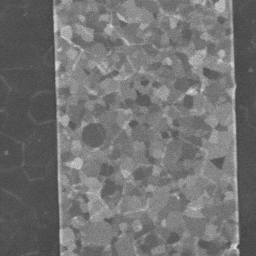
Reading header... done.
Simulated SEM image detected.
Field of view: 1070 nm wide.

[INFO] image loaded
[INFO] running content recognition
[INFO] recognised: one or a few lines or trenches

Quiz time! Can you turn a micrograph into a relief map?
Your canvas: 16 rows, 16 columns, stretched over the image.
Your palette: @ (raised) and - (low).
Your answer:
---@@@@@@@@@@@--
---@@@@@@@@@@@--
---@@@@@@@@@@@--
----@@@@@@@@@@@-
----@@@@@@@@@@@-
----@@@@@@@@@@@-
----@@@@@@@@@@@-
----@@@@@@@@@@@-
----@@@@@@@@@@@-
----@@@@@@@@@@@-
----@@@@@@@@@@@-
----@@@@@@@@@@@-
----@@@@@@@@@@@-
----@@@@@@@@@@@-
----@@@@@@@@@@@-
----@@@@@@@@@@@-